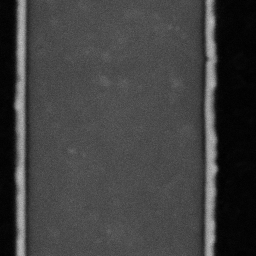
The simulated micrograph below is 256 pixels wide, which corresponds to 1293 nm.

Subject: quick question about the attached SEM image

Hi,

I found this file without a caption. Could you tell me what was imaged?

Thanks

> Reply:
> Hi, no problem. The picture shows one or a few lines or trenches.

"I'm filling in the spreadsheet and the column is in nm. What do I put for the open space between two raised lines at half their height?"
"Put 931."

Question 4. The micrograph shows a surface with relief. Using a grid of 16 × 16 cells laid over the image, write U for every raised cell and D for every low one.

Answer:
UDDDDDDDDDDDDUUU
UDDDDDDDDDDDDUUU
UDDDDDDDDDDDDUUU
UDDDDDDDDDDDDUUU
UDDDDDDDDDDDDUUU
UDDDDDDDDDDDDUUU
UDDDDDDDDDDDDUUU
UDDDDDDDDDDDDUUU
UDDDDDDDDDDDDUUU
UDDDDDDDDDDDDUUU
UDDDDDDDDDDDDUUU
UDDDDDDDDDDDDUUU
UDDDDDDDDDDDDUUU
UDDDDDDDDDDDDUUU
UDDDDDDDDDDDDUUU
UDDDDDDDDDDDDUUU